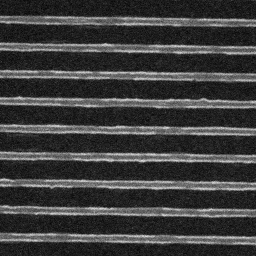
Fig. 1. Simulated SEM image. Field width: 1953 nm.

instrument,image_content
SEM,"parallel lines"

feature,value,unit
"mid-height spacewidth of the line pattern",149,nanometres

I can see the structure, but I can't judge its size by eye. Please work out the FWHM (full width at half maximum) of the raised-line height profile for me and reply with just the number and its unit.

0.0572 microns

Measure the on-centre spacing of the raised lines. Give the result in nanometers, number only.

208